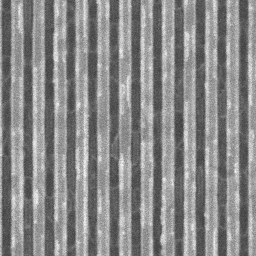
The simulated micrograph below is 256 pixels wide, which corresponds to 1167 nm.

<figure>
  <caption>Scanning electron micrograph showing parallel lines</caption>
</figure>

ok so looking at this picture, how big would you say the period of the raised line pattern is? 0.0982 microns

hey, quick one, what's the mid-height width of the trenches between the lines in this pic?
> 0.0502 microns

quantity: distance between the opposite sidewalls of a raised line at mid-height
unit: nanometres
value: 50.2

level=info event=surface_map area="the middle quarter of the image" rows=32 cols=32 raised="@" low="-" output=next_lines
---@@@---@@---@@@--@@@---@@---@@
---@@@---@@---@@@--@@@---@@---@@
---@@@---@@---@@@--@@@---@@---@@
---@@@---@@---@@@--@@@---@@---@@
---@@@---@@---@@@--@@@---@@---@@
---@@@---@@---@@@---@@---@@---@@
---@@@---@@---@@@---@@---@@---@@
---@@@---@@---@@@---@@---@@---@@
---@@@---@@---@@@---@@---@@---@@
---@@@---@@---@@@---@@---@@---@@
---@@@---@@---@@@---@@---@@---@@
---@@@---@@---@@@---@@---@@---@@
---@@@---@@---@@@---@@---@@---@@
---@@@---@@---@@@---@@---@@---@@
---@@@---@@---@@@---@@---@@---@@
---@@@---@@---@@@---@@---@@---@@
---@@@---@@---@@@---@@---@@---@@
---@@@---@@---@@@---@@---@@---@@
---@@@---@@---@@@---@@---@@---@@
---@@@---@@---@@@--@@@---@@---@@
---@@@---@@---@@@--@@@---@@---@@
---@@@---@@---@@@--@@@---@@---@@
---@@@---@@---@@@--@@@---@@---@@
---@@@---@@---@@@--@@@---@@---@@
---@@@---@@---@@@--@@@---@@---@@
---@@@---@@---@@@--@@@---@@---@@
---@@@---@@---@@@---@@---@@---@@
---@@@---@@---@@@---@@---@@---@@
---@@@---@@---@@@---@@---@@---@@
---@@@---@@---@@@---@@---@@---@@
---@@@---@@---@@@---@@---@@---@@
---@@@---@@---@@@---@@---@@---@@